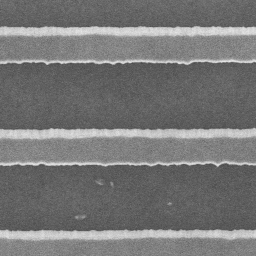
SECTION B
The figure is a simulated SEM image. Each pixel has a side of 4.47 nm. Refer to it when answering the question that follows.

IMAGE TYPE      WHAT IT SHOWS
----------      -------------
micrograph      lines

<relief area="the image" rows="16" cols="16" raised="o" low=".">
................
................
oooooooooooooooo
oooooooooooooooo
................
................
................
................
oooooooooooooooo
oooooooooooooooo
................
................
................
................
.........ooooo.o
oooooooooooooooo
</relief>